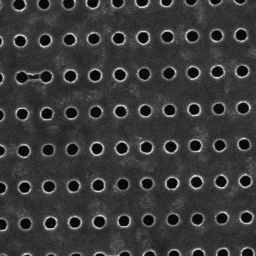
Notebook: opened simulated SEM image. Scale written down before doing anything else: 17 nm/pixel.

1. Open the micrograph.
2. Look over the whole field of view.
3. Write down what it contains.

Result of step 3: a regular array of holes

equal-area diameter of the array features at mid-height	195	nm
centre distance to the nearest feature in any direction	414	nm